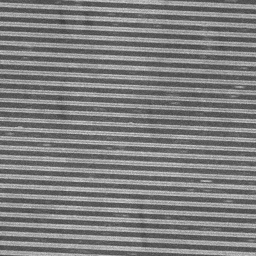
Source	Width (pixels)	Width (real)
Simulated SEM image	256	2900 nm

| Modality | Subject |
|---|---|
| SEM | parallel lines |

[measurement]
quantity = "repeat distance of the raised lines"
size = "108 nanometres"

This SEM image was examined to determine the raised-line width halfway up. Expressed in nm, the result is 32.5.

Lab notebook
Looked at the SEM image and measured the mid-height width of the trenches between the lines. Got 75 nm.